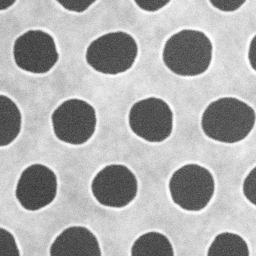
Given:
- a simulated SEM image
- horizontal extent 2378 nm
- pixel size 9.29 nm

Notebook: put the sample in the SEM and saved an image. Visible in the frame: a regular array of holes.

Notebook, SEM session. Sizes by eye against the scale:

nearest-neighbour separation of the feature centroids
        704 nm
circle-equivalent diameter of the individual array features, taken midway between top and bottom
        431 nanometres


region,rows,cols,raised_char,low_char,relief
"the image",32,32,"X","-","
--XXXXX-----XXXXX----XXXXX----XX
XXXXXXXXX-XXXXXXXX-XXXXXXXXX-XXX
XXXXXXXXXXXXXXXXXXXXXXXXXXXXXXXX
XXXXXXXXXXXXXXXXXXXXXXXXXXXXXXXX
XX----XXXXXXX---XXXXX-----XXXXXX
XX-----XXXX------XXX-------XXXX-
XX-----XXXX------XXX-------XXXX-
XX-----XXXX------XXX------XXXXX-
XX----XXXXXX----XXXXX-----XXXXXX
XXXXXXXXXXXXXXXXXXXXXXX--XXXXXXX
XXXXXXXXXXXXXXXXXXXXXXXXXXXXXXXX
XXXXXXXXXXXXXXXXXXXXXXXXXXXXXXXX
--XXXXXX--XXXXXXXX--XXXXXXX---XX
--XXXXX-----XXXX-----XXXXX------
---XXX------XXXX------XXX-------
---XXX------XXXX------XXX-------
---XXXX-----XXXXX----XXXX------X
--XXXXX----XXXXXXX---XXXXXX---XX
XXXXXXXXXXXXXXXXXXXXXXXXXXXXXXXX
XXXXXXXXXXXXXXXXXXXXXXXXXXXXXXXX
XXXX-XXXXXXXXX-XXXXXXXX--XXXXXXX
XXX----XXXXX-----XXXXX----XXXXX-
XX-----XXXXX-----XXXX------XXX--
XX-----XXXX------XXXX------XXX--
XX-----XXXXX-----XXXX------XXXX-
XXX---XXXXXXX---XXXXXX----XXXXXX
XXXXXXXXXXXXXXXXXXXXXXXXXXXXXXXX
XXXXXXXXXXXXXXXXXXXXXXXXXXXXXXXX
XXXXXXXX---XXXXXXXXXXXXXXXXXXXXX
--XXXXX-----XXXXX----XXXXXX---XX
--XXXX------XXXXX----XXXXX-----X
---XXX-------XXX------XXXX-----X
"